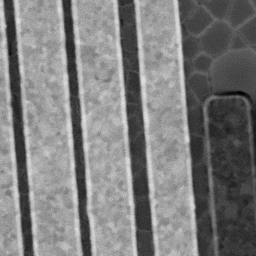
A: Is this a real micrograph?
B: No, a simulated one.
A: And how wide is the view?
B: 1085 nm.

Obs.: parallel lines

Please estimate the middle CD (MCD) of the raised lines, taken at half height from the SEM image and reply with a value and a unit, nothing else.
179 nanometers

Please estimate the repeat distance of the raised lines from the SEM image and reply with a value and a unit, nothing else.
252 nanometers